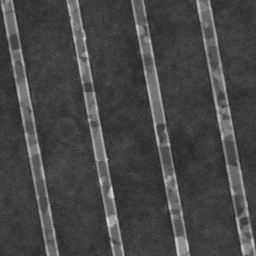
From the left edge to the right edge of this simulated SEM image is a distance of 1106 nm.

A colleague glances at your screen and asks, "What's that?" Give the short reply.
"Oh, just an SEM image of one or a few lines or trenches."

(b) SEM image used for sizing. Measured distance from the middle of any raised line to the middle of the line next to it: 279 nanometres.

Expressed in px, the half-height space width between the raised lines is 53.9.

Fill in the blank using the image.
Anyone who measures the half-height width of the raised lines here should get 45.8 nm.